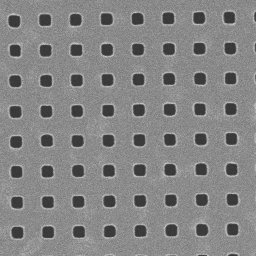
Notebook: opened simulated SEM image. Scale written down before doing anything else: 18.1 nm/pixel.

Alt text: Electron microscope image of a regular array of holes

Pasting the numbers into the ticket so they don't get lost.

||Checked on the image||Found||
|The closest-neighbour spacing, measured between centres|30.1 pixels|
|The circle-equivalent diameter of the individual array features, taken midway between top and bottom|236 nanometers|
